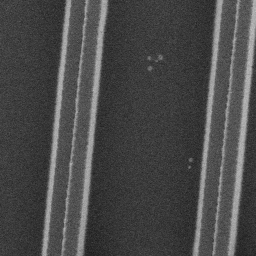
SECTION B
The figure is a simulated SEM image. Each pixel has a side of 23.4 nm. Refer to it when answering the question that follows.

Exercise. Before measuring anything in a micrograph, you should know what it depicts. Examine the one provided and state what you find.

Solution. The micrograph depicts lines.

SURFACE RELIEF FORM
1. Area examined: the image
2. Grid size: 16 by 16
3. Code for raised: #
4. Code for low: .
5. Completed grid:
....##........##
....##........##
....##........##
....##........##
....##.......##.
....##.......##.
....##.......##.
....##.......##.
....##.......##.
...###.......##.
...##........##.
...##........##.
...##........##.
...##........##.
...##.......###.
...##.......##..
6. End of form